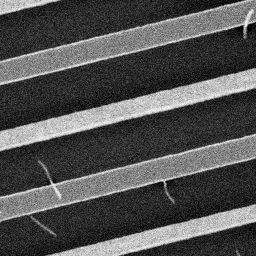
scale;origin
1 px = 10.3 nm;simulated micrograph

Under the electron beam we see lines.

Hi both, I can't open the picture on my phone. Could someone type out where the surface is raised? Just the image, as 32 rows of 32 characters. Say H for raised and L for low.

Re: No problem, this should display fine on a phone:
HHHHHLLLLLLLLLLLLLLLLLLLLLLLLHHH
HLLLLLLLLLLLLLLLLLLLLLLLLHHHHHHH
LLLLLLLLLLLLLLLLLLLLLHHHHHHHHHHH
LLLLLLLLLLLLLLLLLHHHHHHHHHHHHLLL
LLLLLLLLLLLLLHHHHHHHHHHHHLLLLLLL
LLLLLLLLLHHHHHHHHHHHHLLLLLLLLLLL
LLLLLHHHHHHHHHHHHLLLLLLLLLLLLLLL
LHHHHHHHHHHHLLLLLLLLLLLLLLLLLLLL
HHHHHHHHHLLLLLLLLLLLLLLLLLLLLLLL
HHHHHLLLLLLLLLLLLLLLLLLLLLLLHHHH
HLLLLLLLLLLLLLLLLLLLLLLLHHHHHHHH
LLLLLLLLLLLLLLLLLLLLHHHHHHHHHLLL
LLLLLLLLLLLLLLLLHHHHHHHHHLLLLLLL
LLLLLLLLLLLLHHHHHHHHHLLLLLLLLLLL
LLLLLLLLHHHHHHHHHLLLLLLLLLLLLLLL
LLLLHHHHHHHHHLLLLLLLLLLLLLLLLLLL
HHHHHHHHHLLLLLLLLLLLLLLLLLLLLLLL
HHHHHLLLLLLLLLLLLLLLLLLLLLLLLHHH
HLLLLLLLLLLLLLLLLLLLLLLLLHHHHHHH
LLLLLLLLLLLLLLLLLLLLLHHHHHHHHHHH
LLLLLLLLLLLLLLLLLHHHHHHHHHHHHLLL
LLLLLLLLLLLLLHHHHHHHHHHHHLLLLLLL
LLLLLLLLLHHHHHHHHHHHHLLLLLLLLLLL
LLLLLHHHHHHHHHHHHLLLLLLLLLLLLLLL
LHHHHHHHHHHHHLLLLLLLLLLLLLLLLLLL
HHHHHHHHHLLLLLLLLLLLLLLLLLLLLLLL
HHHHHLLLLLLLLLLLLLLLLLLLLLLLHHHH
HLLLLLLLLLLLLLLLLLLLLLLLHHHHHHHH
LLLLLLLLLLLLLLLLLLLLHHHHHHHHLLLL
LLLLLLLLLLLLLLLLHHHHHHHHLLLLLLLL
LLLLLLLLLLLLHHHHHHHHLLLLLLLLLLLL
LLLLLLLLHHHHHHHHLLLLLLLLLLLLLLLL